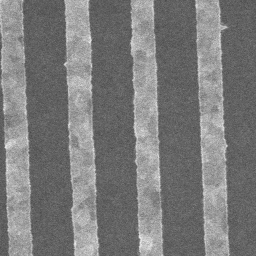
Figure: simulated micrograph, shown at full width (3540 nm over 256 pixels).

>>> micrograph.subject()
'one or a few lines or trenches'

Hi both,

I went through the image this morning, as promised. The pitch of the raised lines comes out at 65.6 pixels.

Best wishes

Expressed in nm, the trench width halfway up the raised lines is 591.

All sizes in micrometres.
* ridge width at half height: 0.313